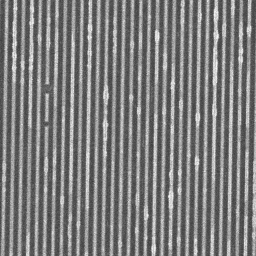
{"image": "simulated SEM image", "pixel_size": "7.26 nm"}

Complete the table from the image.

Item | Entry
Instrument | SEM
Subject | parallel lines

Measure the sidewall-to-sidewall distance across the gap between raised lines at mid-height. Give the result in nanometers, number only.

38.1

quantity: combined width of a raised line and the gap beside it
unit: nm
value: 60.8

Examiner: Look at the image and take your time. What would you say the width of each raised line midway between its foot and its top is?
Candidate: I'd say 25.4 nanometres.